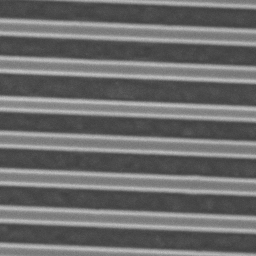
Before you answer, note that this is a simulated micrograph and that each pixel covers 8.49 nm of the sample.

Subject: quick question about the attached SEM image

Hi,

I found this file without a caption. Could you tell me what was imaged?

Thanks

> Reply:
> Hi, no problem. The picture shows parallel lines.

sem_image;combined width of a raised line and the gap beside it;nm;317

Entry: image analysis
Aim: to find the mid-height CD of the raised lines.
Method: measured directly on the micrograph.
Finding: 122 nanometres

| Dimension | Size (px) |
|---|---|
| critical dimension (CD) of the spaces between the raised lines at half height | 23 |